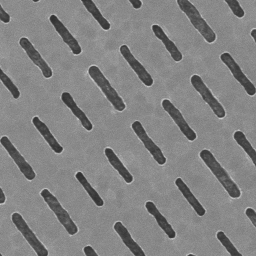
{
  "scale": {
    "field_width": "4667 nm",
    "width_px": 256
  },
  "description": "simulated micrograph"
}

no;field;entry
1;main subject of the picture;a regular array of holes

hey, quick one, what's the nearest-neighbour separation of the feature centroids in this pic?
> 681 nm